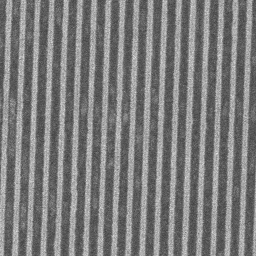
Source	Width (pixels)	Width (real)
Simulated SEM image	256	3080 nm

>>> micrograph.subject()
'parallel lines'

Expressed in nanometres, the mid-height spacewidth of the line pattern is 113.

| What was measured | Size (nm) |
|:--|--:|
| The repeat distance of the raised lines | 170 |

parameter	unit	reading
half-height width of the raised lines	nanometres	60.1